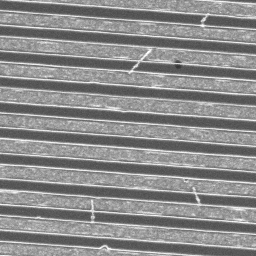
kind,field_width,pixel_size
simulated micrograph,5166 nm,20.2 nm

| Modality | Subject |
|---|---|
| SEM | parallel lines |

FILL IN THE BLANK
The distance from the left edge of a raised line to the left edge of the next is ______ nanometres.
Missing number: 515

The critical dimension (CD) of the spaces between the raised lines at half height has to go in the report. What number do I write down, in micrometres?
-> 0.279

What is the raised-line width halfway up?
229 nm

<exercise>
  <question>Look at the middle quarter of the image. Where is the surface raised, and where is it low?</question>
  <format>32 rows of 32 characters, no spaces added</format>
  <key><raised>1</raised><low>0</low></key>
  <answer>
11111111111111111111111111111111
00000000000111111111111111111111
00000000000000000000000011111111
00000000000000000000000000000000
11000000000000000000000000000000
11111111111111111100000000000000
11111111111111111111111111111011
00000001111111111111111111111111
00000000000000000000111111111111
00000000000000000000000000000000
00000000000000000000000000000000
11111111111100000000000000000000
11111111111111111111111110000000
11111111111111111111111111111111
00000000000000111111111111111111
00000000000000000000000000011111
00000000000000000000000000000000
11111100000000000000000000000000
11111111111111111111100000000000
11111111111111111111111111111111
00000000001111111111111111111111
00000000000000000000000111111111
00000000000000000000000000000000
10000000000000000000000000000000
11111111111111000000000000000000
11111111111111111111111111110000
00011111111111111111111111111111
00000000000000001111111111111111
00000000000000000000000000000011
00000000000000000000000000000000
11111111000000000000000000000000
11111111111111111111100000000000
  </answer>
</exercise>